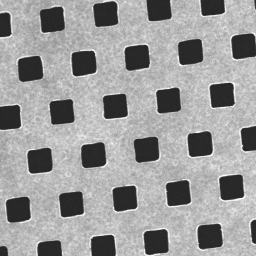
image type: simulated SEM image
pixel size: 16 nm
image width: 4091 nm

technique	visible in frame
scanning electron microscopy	a regular array of holes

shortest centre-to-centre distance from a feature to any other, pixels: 53.4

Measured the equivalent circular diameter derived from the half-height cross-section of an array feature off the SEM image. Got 426 nanometres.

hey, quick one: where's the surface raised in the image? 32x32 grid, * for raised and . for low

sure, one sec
************...***...****...****
*****...****...***...****...****
.****...****...****..***********
.****...************************
.****************************...
**********************...****...
**********..****...***...****...
**...****...****...***...*******
**...****...****..**************
**...***************************
***************************..***
********************..****...***
********.****...****...***...***
..****...****...****...*********
...***...****...****************
...****.************************
*************************.****..
*****************...***....***..
**********...****...****...***..
***....***...****...****..******
***....***...*******************
****..**************************
***************************...**
**************...****...***...**
********..****...****...****..**
*...***...****...****..*********
*...****..**********************
*..*****************************
*************************...***.
************..****...****...***.
*****...***...****...****...****
.****...***...****...***********